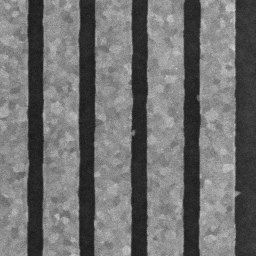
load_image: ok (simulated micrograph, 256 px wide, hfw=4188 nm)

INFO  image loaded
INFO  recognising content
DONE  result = wiring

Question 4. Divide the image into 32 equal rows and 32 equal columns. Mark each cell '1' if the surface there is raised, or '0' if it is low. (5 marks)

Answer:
11100111110011110001111001111000
11100111110011110001111001111000
11100111110011110011111001111000
11100111110011110011111001111000
11100011110011110001111001111000
11100111110011110001111001111000
11100111110011110001111001111000
11100111110011110001111001111000
11100111110011110011111001111000
11100111110011110011111001111000
11100111110011110001111001111000
11100111110011110001111001111000
11100111110011111011111001111000
11100111110011111011111001111000
11100111110011110011111001111000
11100111110011110011111001111000
11100111110011110011111001111000
11100011110011110001111001111000
11100111110011110011111001111000
11100111110011110011111001111000
11100111110011110011111001111000
11100111110011110011111001111000
11100111110011110011111001111000
11100111110011110011111001111000
11100111110011110011111001111000
11100111110011110011111001111000
11100111110011110001111001111000
11100111110011110001111001111000
11100111110011110011111001111000
11100111110011110011111001111000
11100111110011110001111001111000
11100111110011110001111001111000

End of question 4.